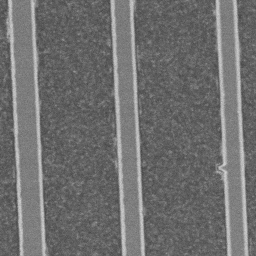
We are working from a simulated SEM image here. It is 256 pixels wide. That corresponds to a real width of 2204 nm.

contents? one or a few lines or trenches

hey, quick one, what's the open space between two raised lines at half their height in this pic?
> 712 nanometres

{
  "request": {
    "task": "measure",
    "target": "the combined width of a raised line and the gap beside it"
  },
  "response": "881 nm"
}